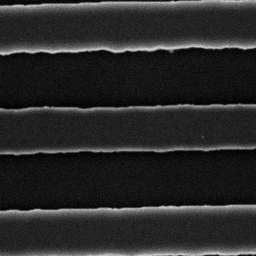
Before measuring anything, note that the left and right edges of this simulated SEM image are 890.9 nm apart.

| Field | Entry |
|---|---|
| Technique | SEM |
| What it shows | lines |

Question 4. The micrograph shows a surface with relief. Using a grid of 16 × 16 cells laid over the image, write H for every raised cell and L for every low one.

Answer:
HHHHHHHHHHHHHHHH
HHHHHHHHHHHHHHHH
HHHHHHHHHHHHHHHH
LLLLLLLLLLLLLLLL
LLLLLLLLLLLLLLLL
LLLLLLLLLLLLLLLL
LLLLLLLLLLLLLLLL
HHHHHHHHHHHHHHHH
HHHHHHHHHHHHHHHH
HHHHLLLLLLLLLLLL
LLLLLLLLLLLLLLLL
LLLLLLLLLLLLLLLL
LLLLLLLLLLLLLLLL
HHHHHHHHHHHHHHHH
HHHHHHHHHHHHHHHH
HHHHHHHHHHHHHHHH